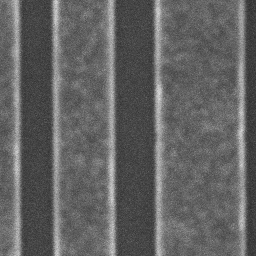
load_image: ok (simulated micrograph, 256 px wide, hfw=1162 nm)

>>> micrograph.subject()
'one or a few lines or trenches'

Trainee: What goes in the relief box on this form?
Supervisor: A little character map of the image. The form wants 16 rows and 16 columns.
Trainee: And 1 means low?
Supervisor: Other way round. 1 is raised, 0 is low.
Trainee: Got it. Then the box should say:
1001111000111110
1001111000111110
1001111000111110
1001111000111110
1001111000111110
1001111000111110
1001111000111110
1001111000111110
1001111000111110
1001111000111110
1001111000111110
1001111000111110
1001111000111110
1000111000111110
1000111000111110
1000111000111110